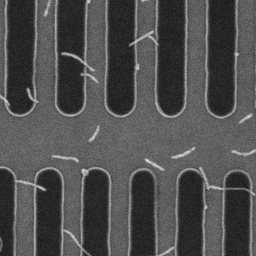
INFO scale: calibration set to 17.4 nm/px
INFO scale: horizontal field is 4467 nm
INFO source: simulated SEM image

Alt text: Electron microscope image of groups of lines, slits or small figures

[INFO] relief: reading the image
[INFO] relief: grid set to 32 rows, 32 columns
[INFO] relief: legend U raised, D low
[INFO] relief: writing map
DUUUUDDUUUUDDUUUUDDDUUUDDDUUUUDD
DUUUDDDUUUUDDUUUUDDDUUUDDDUUUUDD
DUUUDDDUUUUDDUUUUDDDUUUDDDUUUUDD
DUUUUDDUUUUDDUUUUDDDUUUDDDUUUUDD
DUUUUDDUUUUDDUUUUDDUUUUDDDUUUUDD
DUUUDDDUUUUDDUUUUDDUUUUDDDUUUUDD
DUUUDDDUUUUDDUUUUDDDUUUDDDUUUUDD
DUUUDDDUUUUDDUUUUDDDUUUDDDUUUUDD
DUUUDDDUUUUDDUUUUDDDUUUDDDUUUDDD
DUUUDDDUUUUDDUUUUDDDUUUDDDUUUDDD
DUUUDDDUUUUDDUUUUDDUUUUDDDUUUDDD
DUUUDDDUUUUDDUUUUDDUUUUDDDUUUDDD
DUUUDDDUUUUDDUUUUDDDUUUDDDUUUDDD
DUUUDDDUUUDDDUUUUDDDUUUDDDUUUDDD
DDDDDDDDDDDDDDDUDDDDDUDDDDDUUDDD
DDDDDDDDDDDDDDDDDDDDDDDDDDDDDDDD
DDDDDDDDDDDDDDDDDDDDDDDDDDDDDDDD
DDDDDDDDDDDDDDDDDDDDDDDDDDDDDDDD
DDDDDDDDDDDDDDDDDDDDDDDDDDDDDDDD
DDDDDDDDDDDDDDDDDDDDDDDDDDDDDDDD
DDDDDDDDDDDDDDDDDDDDDDDDDDDDDDDD
UUDDDUUDDDDUUDDDDUUDDDDUUDDDDUDD
UUDDUUUUDDUUUUDDUUUDDDUUUUDDUUUD
UUDDUUUUDDUUUUDDUUUDDDUUUDDDUUUD
UUDDUUUUDDUUUUDDUUUDDDUUUDDDUUUU
UUDDUUUUDDUUUUDDUUUDDDUUUUDDUUUD
UUDDUUUUDDUUUUDDUUUDDDUUUUDDUUUD
UUDDUUUUDDUUUUDDUUUDDDUUUDDDUUUD
UUDDUUUUDDUUUUDDUUUDDDUUUDDDUUUD
UUDDUUUUDDUUUUDDUUUUDDUUUDDDUUUD
UUDDUUUUDDUUUUDDUUUUDDUUUDDDUUUD
UUDDUUUUDDUUUUDDUUUUDDUUUDDDUUUD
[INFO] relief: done